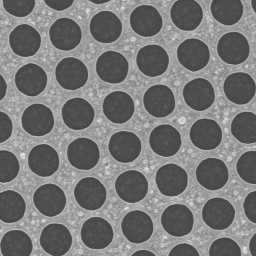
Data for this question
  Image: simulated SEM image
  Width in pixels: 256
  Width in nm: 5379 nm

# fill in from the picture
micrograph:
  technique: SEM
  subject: a regular array of holes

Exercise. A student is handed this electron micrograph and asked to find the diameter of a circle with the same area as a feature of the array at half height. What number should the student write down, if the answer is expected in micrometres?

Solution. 0.689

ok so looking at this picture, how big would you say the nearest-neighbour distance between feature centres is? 844 nm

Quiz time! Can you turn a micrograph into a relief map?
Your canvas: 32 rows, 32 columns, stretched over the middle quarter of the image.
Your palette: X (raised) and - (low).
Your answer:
-----XXX--------XX--------XXXX--
------XX--------XXX-------XXXXX-
------XX--------XXXX-----XXXXXXX
------XXX------XXXXXXXXXXXXXXXXX
------XXXXX---XXXXXXXXXXXXXXXXX-
-----XXXXXXXXXXXXXXXXX----XXXX--
X--XXXXXXXXXXXXXXXXXX------XXX--
XXXXXXXXXXX-----XXXX-------XXX--
XX--XXXXXX-------XXX--------XX--
------XXXX-------XXX--------XX--
-------XXX--------XX--------XXX-
-------XXX--------XX-------XXXXX
--------XX-------XXXXX-----XXXXX
--------XXX------XXXXXX-XXXXXXXX
-------XXXXX----XXXXXXXXXXXXXXXX
X-----XXXXXXXXXXXXXXXXXX---XXXXX
XXX--XXXXXXXXXXXXXXXXX------XXXX
XXXXXXXXXXXXX-----XXXX-------XX-
XXX---XXXXXX-------XX--------XX-
XX------XXX--------XX--------XXX
X--------XX--------XXX-------XXX
X--------XX--------XXX-------XXX
X--------XXX-------XXXX-----XXXX
X--------XXX------XXXXXXXXXXXXXX
X-------XXXXXX---XXXXXXXXXXXXXXX
XX------XXXXXXXXXXXXXXXXX----XXX
XXXX--XXXXXXXXXXXXXXXXXX------XX
XXXXXXXXXXXXXX------XXX--------X
XXXXX---XXXXX-------XXX--------X
XXXX-----XXXX--------XX--------X
XXX-------XXX--------XX--------X
XXX--------XX--------XXX------XX